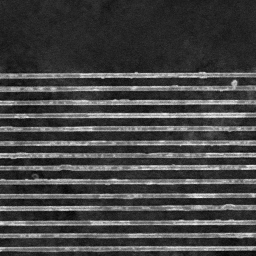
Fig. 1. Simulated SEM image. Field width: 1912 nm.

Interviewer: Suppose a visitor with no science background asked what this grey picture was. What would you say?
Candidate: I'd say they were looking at parallel lines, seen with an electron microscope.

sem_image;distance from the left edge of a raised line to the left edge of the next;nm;99.7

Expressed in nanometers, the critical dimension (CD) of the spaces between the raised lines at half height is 71.9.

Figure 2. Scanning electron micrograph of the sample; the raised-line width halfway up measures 32.7 nanometres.